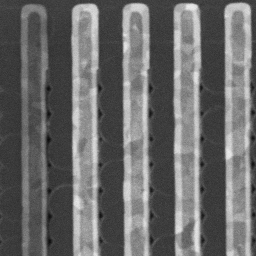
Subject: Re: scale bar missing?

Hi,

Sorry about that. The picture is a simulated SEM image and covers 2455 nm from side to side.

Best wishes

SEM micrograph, wiring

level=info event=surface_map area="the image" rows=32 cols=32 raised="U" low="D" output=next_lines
DDDDDDDDDDDDDDDDDDDDDDDDDDDDDDDD
DDDUUDDDDUUUDDDDUUDDDDUUUDDDDUUD
DDDUUDDDDUUUDDDDUUDDDDUUUDDDDUUD
DDDUUDDDDUUUDDDDUUDDDDUUUDDDDUUD
DDDUUDDDDUUUDDDDUUDDDDUUUDDDDUUD
DDDUUUDDDUUUDDDDUUDDDDUUUDDDDUUD
DDDUUUDDDUUUDDDDUUDDDDUUUDDDDUUD
DDDUUUDDDUUUDDDDUUDDDDUUUDDDDUUD
DDDUUUDDDUUUDDDDUUDDDDUUUDDDDUUD
DDDUUDDDDUUUDDDDUUDDDDUUUDDDDUUD
DDDUUDDDDUUUDDDDUUDDDDUUUDDDDUUD
DDDUUDDDDUUUDDDDUUDDDDUUUDDDDUUD
DDDUUDDDDUUUDDDDUUDDDDUUUDDDDUUD
DDDUUDDDDUUUDDDDUUDDDDUUUDDDDUUD
DDDUUDDDDUUUDDDDUUDDDDUUUDDDDUUD
DDDUUDDDDUUUDDDDUUDDDDUUUDDDDUUD
DDDUUDDDDUUUDDDDUUDDDDUUUDDDDUUD
DDDUUDDDDUUUDDDDUUDDDDUUUDDDDUUD
DDDUUDDDDDUUDDDDUUDDDDUUUDDDDUUD
DDDUUDDDDDUUDDDDUUDDDDUUUDDDDUUD
DDDUUDDDDDUUDDDDUUDDDDUUUDDDDUUD
DDDUUDDDDDUUDDDDUUDDDDUUUDDDDUUD
DDDUUDDDDDUUDDDDUUDDDDUUUDDDDUUD
DDDUUDDDDDUUDDDDUUDDDDUUUDDDDUUD
DDDUUUDDDDUUDDDDUUDDDDUUUDDDDUUD
DDDUUUDDDDUUDDDDUUDDDDUUUDDDDUUD
DDDUUDDDDDUUDDDDUUDDDDUUUDDDDUUD
DDDUUDDDDDUUDDDDUUDDDDUUUDDDDUUD
DDDUUDDDDDUUDDDDUUDDDDUUUDDDDUUD
DDDUUDDDDDUUDDDDUUDDDDUUUDDDDUUD
DDDUUDDDDDUUDDDDUUDDDDUUUDDDDUUD
DDDUUUDDDDUUDDDDUUDDDDUUUDDDDUUD